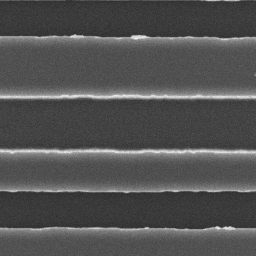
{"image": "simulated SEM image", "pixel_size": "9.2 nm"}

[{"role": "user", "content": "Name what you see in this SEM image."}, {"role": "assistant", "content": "lines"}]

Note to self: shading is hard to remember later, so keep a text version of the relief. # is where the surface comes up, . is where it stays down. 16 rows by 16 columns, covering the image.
................
................
################
################
################
################
................
................
................
.....##.........
################
################
................
................
################
################